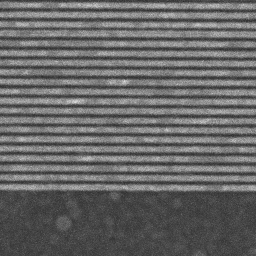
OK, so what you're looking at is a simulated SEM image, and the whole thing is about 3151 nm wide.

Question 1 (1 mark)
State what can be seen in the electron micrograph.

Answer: parallel lines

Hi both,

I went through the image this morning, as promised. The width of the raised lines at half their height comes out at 0.0523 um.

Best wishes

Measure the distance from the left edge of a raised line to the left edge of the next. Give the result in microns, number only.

0.118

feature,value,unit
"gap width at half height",63.1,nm